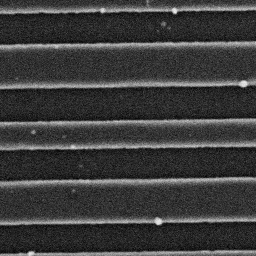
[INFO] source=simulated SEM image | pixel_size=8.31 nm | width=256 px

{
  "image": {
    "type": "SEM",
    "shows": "lines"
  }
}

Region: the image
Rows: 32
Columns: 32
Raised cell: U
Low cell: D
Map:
UUUUUUUUUUUUUUUUUUUUUUUUUUUUUUUU
UUUUUDUUUDDDUDDDDDDDDUDDDDDDDDDD
DDDDDDDDDDDDDDDDDDDDDDDDDDDDDDDD
DDDDDDDDDDDDDDDDDDDDDDDDDDDDDDDD
DDDDDDDDDDDDDDDDDDDDDDDDDDDDDDDD
DDDDDDDDDDDDDDDDUDUUUUUUUUUUUUUU
UUUUUUUUUUUUUUUUUUUUUUUUUUUUUUUU
UUUUUUUUUUUUUUUUUUUUUUUUUUUUUUUU
UUUUUUUUUUUUUUUUUUUUUUUUUUUUUUUU
UUUUUUUUUUUUUUUUUUUUUUUUUUUUUUUU
UUUUUUUUUUUUUUUUUUUUUUUUUUUUUUUD
DDDDDDDDDDDDDDDDDDDDDDDDDDDDDDDD
DDDDDDDDDDDDDDDDDDDDDDDDDDDDDDDD
DDDDDDDDDDDDDDDDDDDDDDDDDDDDDDDD
DDDDDDDDDDDDDDDDDDDDDDDDDDDDDDDD
UUUUUUUUUUUUUUUUUUUUUUUUUUUUUUUU
UUUUUUUUUUUUUUUUUUUUUUUUUUUUUUUU
UUUUUUUUUUUUUUUUUUUUUUUUUUUUUUUU
UUUUUUUUUUDDDDDDDDDDDDDDDDDDDDDD
DDDDDDDDDDDDDDDDDDDDDDDDDDDDDDDD
DDDDDDDDDDDDDDDDDDDDDDDDDDDDDDDD
DDDDDDDDDDDDDDDDDDDDDDDDDDDDDDDD
DDDDDDDDDDDDDDDDDDDDDUUUUUUUUUUU
UUUUUUUUUUUUUUUUUUUUUUUUUUUUUUUU
UUUUUUUUUUUUUUUUUUUUUUUUUUUUUUUU
UUUUUUUUUUUUUUUUUUUUUUUUUUUUUUUU
UUUUUUUUUUUUUUUUUUUUUUUUUUUUUUUU
UUUUUUUUUUUUUUUUUUUUUUUUUUUUUUUU
DDDDDDDDDDDDDDDDDDDDDDDDDDDDDDDD
DDDDDDDDDDDDDDDDDDDDDDDDDDDDDDDD
DDDDDDDDDDDDDDDDDDDDDDDDDDDDDDDD
DDDDDDDDDDDDDDDDDDDDDUUUUUUUUUUU